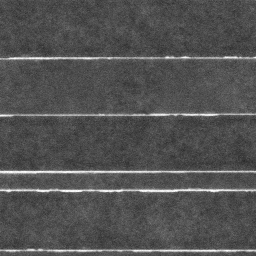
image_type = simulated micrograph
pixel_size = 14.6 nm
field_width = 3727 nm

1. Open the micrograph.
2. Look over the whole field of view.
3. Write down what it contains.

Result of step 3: lines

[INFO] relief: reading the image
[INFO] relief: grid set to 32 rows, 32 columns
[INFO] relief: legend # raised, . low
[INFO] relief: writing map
................................
................................
................................
................................
................................
................................
................................
################################
################################
################################
################################
################################
################################
################################
................................
................................
................................
................................
................................
................................
................................
...#############################
################################
################################
................................
................................
................................
................................
................................
................................
................................
################################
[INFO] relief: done